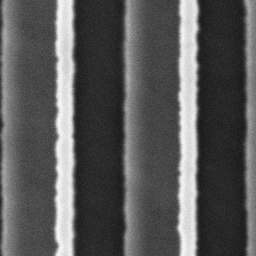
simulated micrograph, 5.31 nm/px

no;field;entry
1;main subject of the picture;lines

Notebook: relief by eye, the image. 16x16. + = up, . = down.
+++++...++++....
+++++...++++....
+++++...++++....
++++....++++....
+++++...++++....
++++....++++...+
+++++...++++....
+++++...++++....
+++++...++++....
+++++...++++...+
+++++...++++...+
+++++...++++...+
+++++...++++...+
+++++...++++....
++++....++++....
++++....++++....